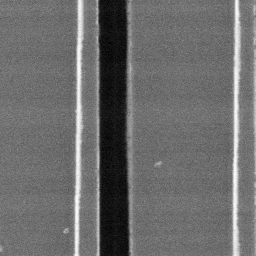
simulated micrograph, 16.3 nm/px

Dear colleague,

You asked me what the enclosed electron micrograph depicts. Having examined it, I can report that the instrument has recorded lines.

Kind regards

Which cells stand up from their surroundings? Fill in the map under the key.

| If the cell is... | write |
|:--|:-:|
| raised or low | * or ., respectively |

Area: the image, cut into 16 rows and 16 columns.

******..********
******..********
******..********
******..********
******..********
******..********
******..********
******..********
******..********
******..********
******..********
******..********
******..********
******..********
******..********
******..********